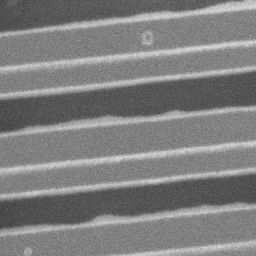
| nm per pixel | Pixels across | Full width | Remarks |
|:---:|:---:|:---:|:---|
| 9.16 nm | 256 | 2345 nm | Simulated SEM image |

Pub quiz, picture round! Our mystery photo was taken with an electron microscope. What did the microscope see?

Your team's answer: lines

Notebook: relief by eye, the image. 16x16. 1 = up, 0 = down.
0000000000000001
0000001111111111
1111111111111111
1111111111111111
1111111111111100
1111100000000000
0000000000000000
0000000001111111
1111111111111111
1111111111111111
1111111111111111
1111111100000000
0000000000000000
0000000000111111
0111111111111111
1111111111111111